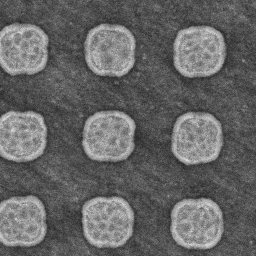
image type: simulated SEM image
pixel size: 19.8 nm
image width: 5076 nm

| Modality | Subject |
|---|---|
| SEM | raised bodies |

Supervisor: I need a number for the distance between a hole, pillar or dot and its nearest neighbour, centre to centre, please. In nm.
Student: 1700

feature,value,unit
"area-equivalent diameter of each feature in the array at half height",972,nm